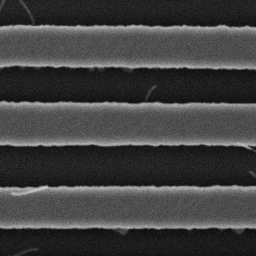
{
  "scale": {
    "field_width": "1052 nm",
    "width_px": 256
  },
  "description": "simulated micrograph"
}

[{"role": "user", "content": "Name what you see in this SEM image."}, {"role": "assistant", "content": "lines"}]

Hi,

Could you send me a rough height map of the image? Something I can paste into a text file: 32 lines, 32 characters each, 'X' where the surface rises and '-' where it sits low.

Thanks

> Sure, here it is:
--------------------------------
--------------------------------
--------------------------------
XXXXXXXXXXXXXXXXXXXXXXXXXXXXXXXX
XXXXXXXXXXXXXXXXXXXXXXXXXXXXXXXX
XXXXXXXXXXXXXXXXXXXXXXXXXXXXXXXX
XXXXXXXXXXXXXXXXXXXXXXXXXXXXXXXX
XXXXXXXXXXXXXXXXXXXXXXXXXXXXXXXX
----------------X-X-XXXXXXXXXXXX
--------------------------------
--------------------------------
--------------------------------
--------------------------------
XXXXXXXXXXXXXXXXXXXXXXXXXXXXXXXX
XXXXXXXXXXXXXXXXXXXXXXXXXXXXXXXX
XXXXXXXXXXXXXXXXXXXXXXXXXXXXXXXX
XXXXXXXXXXXXXXXXXXXXXXXXXXXXXXXX
XXXXXXXXXXXXXXXXXXXXXXXXXXXXXXXX
--------------------------------
--------------------------------
--------------------------------
--------------------------------
--------------------------------
XXXXXXXXXXXXXXXXXXXXXXXXXXXXXXXX
XXXXXXXXXXXXXXXXXXXXXXXXXXXXXXXX
XXXXXXXXXXXXXXXXXXXXXXXXXXXXXXXX
XXXXXXXXXXXXXXXXXXXXXXXXXXXXXXXX
XXXXXXXXXXXXXXXXXXXXXXXXXXXXXXXX
XXXXXXXXXXX--XXXXXXXXXXXXX-XXXXX
--------------------------------
--------------------------------
--------------------------------